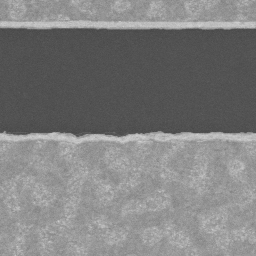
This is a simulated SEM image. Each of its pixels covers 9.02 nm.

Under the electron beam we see one or a few lines or trenches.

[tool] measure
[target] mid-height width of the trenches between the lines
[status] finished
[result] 1.02 um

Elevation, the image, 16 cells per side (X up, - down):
XXXXXXXXXXXXXXXX
XXXXX-XXXXXXXXXX
----------------
----------------
----------------
----------------
----------------
----------------
----------------
XXXXXXXXXXXXXXXX
XXXXXXXXXXXXXXXX
XXXXXXXXXXXXXXXX
XXXXXXXXXXXXXXXX
XXXXXXXXXXXXXXXX
XXXXXXXXXXXXXXXX
XXXXXXXXXXXXXXXX